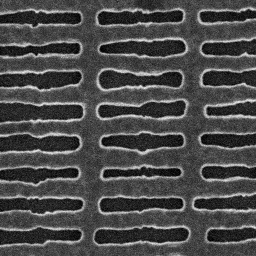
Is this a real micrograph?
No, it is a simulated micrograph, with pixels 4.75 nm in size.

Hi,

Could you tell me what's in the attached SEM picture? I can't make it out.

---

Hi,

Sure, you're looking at a regular array of holes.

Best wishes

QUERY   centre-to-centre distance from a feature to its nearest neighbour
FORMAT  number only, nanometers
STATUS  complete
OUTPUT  148